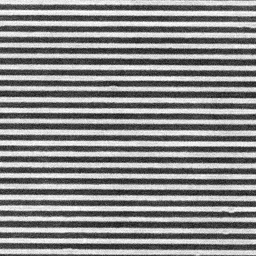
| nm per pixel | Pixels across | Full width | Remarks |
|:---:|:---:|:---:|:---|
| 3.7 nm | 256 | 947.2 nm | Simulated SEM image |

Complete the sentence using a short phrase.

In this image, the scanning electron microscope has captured parallel lines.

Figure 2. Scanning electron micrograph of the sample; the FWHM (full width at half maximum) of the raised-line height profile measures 13.9 nm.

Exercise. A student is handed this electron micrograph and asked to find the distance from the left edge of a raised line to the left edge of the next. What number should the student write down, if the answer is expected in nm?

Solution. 40.2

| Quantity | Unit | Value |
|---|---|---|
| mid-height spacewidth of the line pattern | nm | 24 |